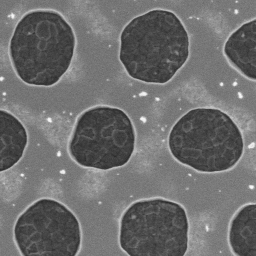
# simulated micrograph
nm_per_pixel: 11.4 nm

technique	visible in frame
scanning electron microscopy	holes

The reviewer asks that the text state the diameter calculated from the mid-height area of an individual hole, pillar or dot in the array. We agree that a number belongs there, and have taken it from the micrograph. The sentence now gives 788 nanometers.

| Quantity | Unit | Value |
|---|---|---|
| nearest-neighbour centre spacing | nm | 1200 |